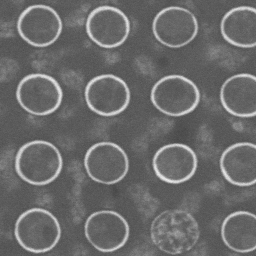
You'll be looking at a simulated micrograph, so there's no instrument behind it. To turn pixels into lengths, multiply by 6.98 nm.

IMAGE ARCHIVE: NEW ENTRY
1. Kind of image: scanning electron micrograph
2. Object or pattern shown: a regular array of raised bodies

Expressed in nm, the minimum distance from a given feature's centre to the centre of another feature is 473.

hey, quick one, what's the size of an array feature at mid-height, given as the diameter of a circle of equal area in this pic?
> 285 nm